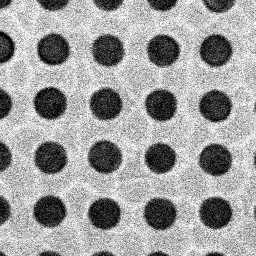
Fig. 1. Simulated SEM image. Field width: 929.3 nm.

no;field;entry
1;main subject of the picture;a regular array of holes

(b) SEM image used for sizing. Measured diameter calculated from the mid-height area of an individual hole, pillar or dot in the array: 32.1 px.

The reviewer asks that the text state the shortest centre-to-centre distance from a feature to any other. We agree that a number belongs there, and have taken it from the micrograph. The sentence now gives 193 nanometers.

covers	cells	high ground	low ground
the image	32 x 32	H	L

LHHHHLLLHHHHLLLHHHHLLLHHHHLLLHHH
HHHHHHHHHHHHHHHHHHHHHHHHHHHLHHHH
HHHHHHHHHHHHHHHHHHHHHHHHHHHHHHHH
HHHHHHHHHHHHHHHHHHHHHHHHHHHHHHHH
LHHHHHLLHHHHLLHHHHHHLHHHHHLLHHHH
LLHHHLLLLHHHLLLHHHHLLLHHHLLLLHHH
LLHHHLLLLHHHLLLLHHLLLLHHHLLLLHHH
LHHHHLLLHHHHLLLHHHHLLLHHHLLLLHHH
HHHHHHHHHHHHHHHHHHHHHHHHHHHHHHHH
HHHHHHHHHHHHHHHHHHHHHHHHHHHHHHHH
HHHHHHHHHHHHHHHHHHHHHHHHHHHHHHHH
LHHHHLLLHHHHLLHHHHHLLHHHHHLLHHHH
LHHHLLLLHHHLLLLHHHLLLLHHHLLLLHHH
LHHHLLLLHHHLLLLHHHLLLLHHHLLLLHHH
LHHHHLLLHHHHLLLHHHHLLLHHHLLLLHHH
HHHHHHHHHHHHHHHHHHHHHHHHHHHHHHHH
HHHHHHHHHHHHHHHHHHHHHHHHHHHHHHHH
HHHHHHHHHHHHHHHHHHHHHHHHHHHHHHHH
LHHHHLLLHHHLLLLHHHHLLHHHHHLLHHHH
LHHHLLLLHHHLLLLHHHLLLLHHHLLLLHHH
LHHHLLLLHHHLLLLHHHLLLLHHHLLLLHHH
HHHHHLLHHHHHLLHHHHHLLHHHHHLLHHHH
HHHHHHHHHHHHHHHHHHHHHHHHHHHHHHHH
HHHHHHHHHHHHHHHHHHHHHHHHHHHHHHHH
HHHHHHHHHHHHHHHHHHHHHHHHHHHHHHHH
LHHHLLLLHHHHLLLHHHLLLLHHHLLLLHHH
LHHHLLLLHHHLLLLHHHLLLLHHHLLLLHHH
LHHHHLLLHHHLLLLHHHLLLLHHHLLLLHHH
HHHHHHHHHHHHLLHHHHHLLHHHHHLHHHHH
HHHHHHHHHHHHHHHHHHHHHHHHHHHHHHHH
HHHHHHHHHHHHHHHHHHHHHHHHHHHHHHHH
HHHHHLLHHHHHLLHHHHHHHHHHHHHHHHHH